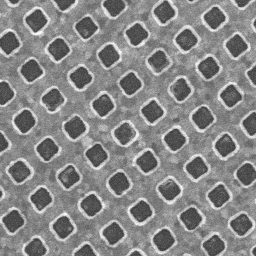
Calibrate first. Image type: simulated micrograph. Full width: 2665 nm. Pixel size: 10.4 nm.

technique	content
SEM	a regular array of holes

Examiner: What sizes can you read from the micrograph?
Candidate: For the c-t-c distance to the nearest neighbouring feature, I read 367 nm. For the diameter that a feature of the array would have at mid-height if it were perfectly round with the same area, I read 229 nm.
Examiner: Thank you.